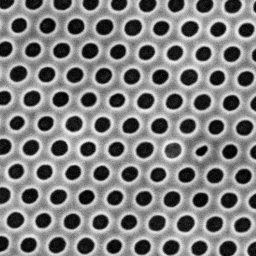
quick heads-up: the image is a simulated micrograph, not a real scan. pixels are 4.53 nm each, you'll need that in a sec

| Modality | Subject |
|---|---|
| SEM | a regular array of holes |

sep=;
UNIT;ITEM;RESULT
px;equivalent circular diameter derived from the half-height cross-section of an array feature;16.5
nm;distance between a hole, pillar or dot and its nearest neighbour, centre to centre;126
